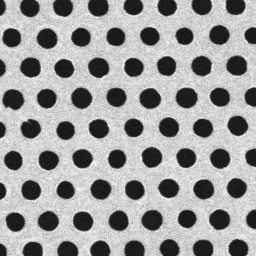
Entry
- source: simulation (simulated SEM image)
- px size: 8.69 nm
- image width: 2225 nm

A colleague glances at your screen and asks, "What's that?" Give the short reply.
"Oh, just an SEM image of a regular array of holes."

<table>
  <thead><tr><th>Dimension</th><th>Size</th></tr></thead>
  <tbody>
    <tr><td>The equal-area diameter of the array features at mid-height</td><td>176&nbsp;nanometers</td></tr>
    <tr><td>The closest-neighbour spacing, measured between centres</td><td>294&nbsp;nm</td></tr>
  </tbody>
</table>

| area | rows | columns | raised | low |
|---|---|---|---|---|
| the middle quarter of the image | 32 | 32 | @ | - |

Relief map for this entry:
--@@@@-----@@@@-----@@@-----@@@@
---@@@-----@@@@-----@@@-----@@@@
--@@@@@----@@@@----@@@@@---@@@@@
-@@@@@@@@@@@@@@@@@@@@@@@@@@@@@@@
@@@@@@@@@@@@@@@@@@@@@@@@@@@@@@@@
@@@@@@@@@@@@@@@@@@@@@@@@@@@@@@@@
@@@---@@@@@----@@@@@---@@@@@@---
@@-----@@@@----@@@@-----@@@@----
@@-----@@@@-----@@@-----@@@@----
@@-----@@@@----@@@@-----@@@@----
@@@---@@@@@@---@@@@@---@@@@@@---
@@@@@@@@@@@@@@@@@@@@@@@@@@@@@@@@
@@@@@@@@@@@@@@@@@@@@@@@@@@@@@@@@
@@@@@@@@@@@@@@@@@-@@@@@@@--@@@@@
-@@@@@@----@@@@@---@@@@@----@@@@
---@@@-----@@@@-----@@@@-----@@@
---@@@-----@@@@-----@@@@-----@@@
---@@@@----@@@@@---@@@@@----@@@@
--@@@@@@--@@@@@@@@@@@@@@@@@@@@@@
@@@@@@@@@@@@@@@@@@@@@@@@@@@@@@@@
@@@@@@@@@@@@@@@@@@@@@@@@@@@@@@@@
@@@---@@@@@@@-@@@@@@----@@@@@---
@@-----@@@@----@@@@-----@@@@----
@@-----@@@@-----@@@------@@@----
@@-----@@@@----@@@@@----@@@@----
@@@----@@@@@---@@@@@@---@@@@@---
@@@@@@@@@@@@@@@@@@@@@@@@@@@@@@@@
@@@@@@@@@@@@@@@@@@@@@@@@@@@@@@@@
@@@@@@@@@@@@@@@@@@@@@@@@@@@@@@@@
-@@@@@@----@@@@@---@@@@@----@@@@
--@@@@@-----@@@-----@@@@-----@@@
---@@@@-----@@@-----@@@@-----@@@